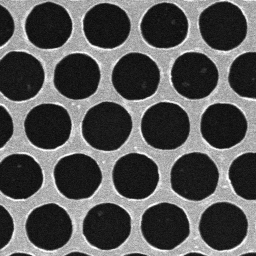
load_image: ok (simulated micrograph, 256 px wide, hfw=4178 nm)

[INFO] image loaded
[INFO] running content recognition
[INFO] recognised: a regular array of holes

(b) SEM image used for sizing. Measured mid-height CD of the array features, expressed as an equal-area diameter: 47.6 px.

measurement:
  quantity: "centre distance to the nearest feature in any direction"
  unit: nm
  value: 940